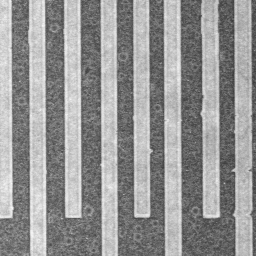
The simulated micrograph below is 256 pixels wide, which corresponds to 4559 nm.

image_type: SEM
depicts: parallel lines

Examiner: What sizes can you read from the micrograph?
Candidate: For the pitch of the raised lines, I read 610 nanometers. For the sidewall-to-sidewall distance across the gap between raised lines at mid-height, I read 356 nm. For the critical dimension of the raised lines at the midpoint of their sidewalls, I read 0.256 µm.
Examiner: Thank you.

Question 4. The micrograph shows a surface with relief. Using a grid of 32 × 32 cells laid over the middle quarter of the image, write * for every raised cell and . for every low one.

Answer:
****......***.....***....****...
****......***.....***....****...
****......***.....***....****...
****......***.....***....****...
****......***.....***....****...
.***......***.....***....****...
.***......***.....***....****...
.***......***.....***....****...
.***......***.....***....****...
.***......***.....***....****...
.***......***.....***....****...
.***......***.....***....****...
.***......***.....***....****...
.***......***.....***....****...
.***......***.....***....****...
.***......***.....***....****...
.***......***.....***....****...
.***......***.....***....****...
.***......***.....***....****...
.***......***.....***....****...
.***......***.....***....****...
.***......***.....****...****...
.***......***.....***....****...
.***......***.....***....****...
.***......***.....***....****...
.***.....****.....***....****...
.***......***.....***....****...
.***......***.....***....****...
.***......***.....***....****...
.***......***.....***....****...
.***......***.....***....****...
.***......***.....***....****...